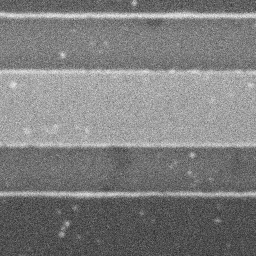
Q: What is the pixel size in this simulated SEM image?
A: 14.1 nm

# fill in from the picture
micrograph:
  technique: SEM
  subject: lines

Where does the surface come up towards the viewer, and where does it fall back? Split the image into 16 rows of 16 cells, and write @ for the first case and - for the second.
@@@@@@@@@@@@@@@@
----------------
----------------
----------------
@@@@@@@@@@@@@@@@
@@@@@@@@@@@@@@@@
@@@@@@@@@@@@@@@@
@@@@@@@@@@@@@@@@
@@@@@@@@@@@@@@@@
----------------
----------------
----------------
@@@@@@@@@@@@@@@@
@@@@@@@@@@@@@@@@
@@@@@@@@@@@@@@@@
@@@@@@@@@@@@@@@@